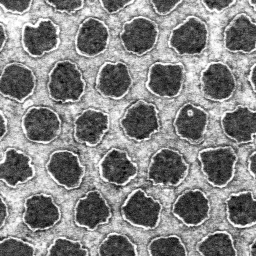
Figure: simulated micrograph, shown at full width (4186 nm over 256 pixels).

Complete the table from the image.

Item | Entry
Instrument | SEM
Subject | a regular array of raised bodies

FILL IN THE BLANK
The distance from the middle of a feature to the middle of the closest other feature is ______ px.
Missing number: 48.5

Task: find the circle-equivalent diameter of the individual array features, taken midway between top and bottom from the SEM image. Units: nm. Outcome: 599